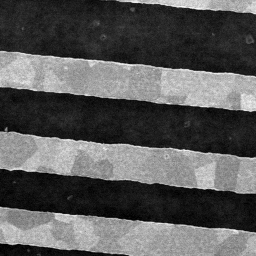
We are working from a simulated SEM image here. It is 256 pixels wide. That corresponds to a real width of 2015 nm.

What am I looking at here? lines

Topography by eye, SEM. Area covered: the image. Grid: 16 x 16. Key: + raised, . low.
............++++
................
................
+++.............
+++++++++++++...
.+++++++++++++++
...........+++++
................
++..............
++++++++++++....
++++++++++++++++
..........++++++
................
++++++..........
++++++++++++++++
....++++++++++++